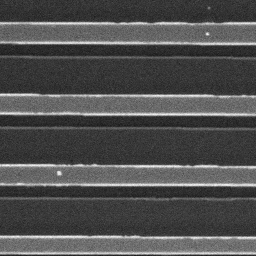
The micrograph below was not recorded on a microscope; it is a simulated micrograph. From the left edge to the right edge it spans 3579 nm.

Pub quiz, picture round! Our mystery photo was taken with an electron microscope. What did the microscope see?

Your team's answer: lines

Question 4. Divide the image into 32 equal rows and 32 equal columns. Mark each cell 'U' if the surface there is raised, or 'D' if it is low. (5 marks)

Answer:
DDDDDDDDDDDDDDDDDDDDDDDDDDDDDDDD
DDDDDDDDDDDDDDDDDDDDDDDDDDDDDDDD
DDDDDDDDDDDDDDDDDDDDDDDDDDDDDDDD
UUUUUUUUUUUUUUUUUUUUUUUUUUUUUUUU
UUUUUUUUUUUUUUUUUUUUUUUUUUUUUUUU
DDDDDDDDDDDDDDDDDDDDDDDDUUUUUUUU
DDDDDDDDDDDDDDDDDDDDDDDDDDDDDDDD
DDDDDDDDDDDDDDDDDDDDDDDDDDDDDDDD
DDDDDDDDDDDDDDDDDDDDDDDDDDDDDDDD
DDDDDDDDDDDDDDDDDDDDDDDDDDDDDDDD
DDDDDDDDDDDDDDDDDDDDDDDDDDDDDDDD
DDDDDDDDDDDDDDDDDDDDDDDDDDDDDDDD
UUUUUUUUUUUUUUUUUUUUUUUUUUUUUUUU
UUUUUUUUUUUUUUUUUUUUUUUUUUUUUUUU
DDDDDDDDDDDDDDDDDDDDDDDDDDDDDDDD
DDDDDDDDDDDDDDDDDDDDDDDDDDDDDDDD
DDDDDDDDDDDDDDDDDDDDDDDDDDDDDDDD
DDDDDDDDDDDDDDDDDDDDDDDDDDDDDDDD
DDDDDDDDDDDDDDDDDDDDDDDDDDDDDDDD
DDDDDDDDDDDDDDDDDDDDDDDDDDDDDDDD
DDDDDDDDDDDDDDDDDDDDDDDDDDDDDDDD
UUUUUUUUUUUUUUUUUUUUUUUUUUUUUUUU
UUUUUUUUUUUUUUUUUUUUUUUUUUUUUUUU
DDDDDDDDDDDDDDDDDDDDDDDDDDDDDDDD
DDDDDDDDDDDDDDDDDDDDDDDDDDDDDDDD
DDDDDDDDDDDDDDDDDDDDDDDDDDDDDDDD
DDDDDDDDDDDDDDDDDDDDDDDDDDDDDDDD
DDDDDDDDDDDDDDDDDDDDDDDDDDDDDDDD
DDDDDDDDDDDDDDDDDDDDDDDDDDDDDDDD
DDDDDDDDDDDDDDDDDDDDDDDDDDDDDDDD
UUUUUUUUUUUUUUUUUUUUUUUUUUUUUUUU
UUUUUUUUUUUUUUUUUUUUUUUUUUUUUUUU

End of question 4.